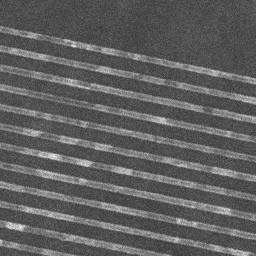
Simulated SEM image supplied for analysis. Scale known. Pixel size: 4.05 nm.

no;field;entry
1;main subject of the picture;parallel lines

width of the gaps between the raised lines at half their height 56.5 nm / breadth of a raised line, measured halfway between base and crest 21.4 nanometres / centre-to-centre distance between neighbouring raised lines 77.1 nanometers